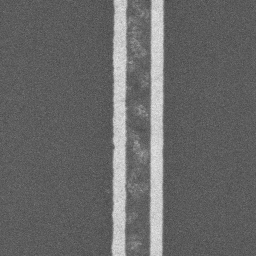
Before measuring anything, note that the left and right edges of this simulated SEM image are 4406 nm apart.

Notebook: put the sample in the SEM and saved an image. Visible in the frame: one or a few lines or trenches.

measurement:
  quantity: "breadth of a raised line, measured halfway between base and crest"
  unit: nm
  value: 680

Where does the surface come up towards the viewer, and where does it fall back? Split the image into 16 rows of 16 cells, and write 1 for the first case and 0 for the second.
0000000111000000
0000000111000000
0000000111000000
0000000111000000
0000000111000000
0000000111000000
0000000111000000
0000000111000000
0000000111000000
0000000111000000
0000000111000000
0000000111000000
0000000111000000
0000000111000000
0000000111000000
0000000111000000